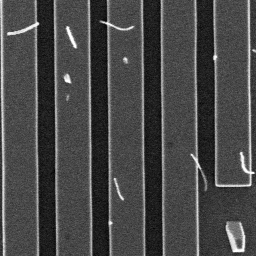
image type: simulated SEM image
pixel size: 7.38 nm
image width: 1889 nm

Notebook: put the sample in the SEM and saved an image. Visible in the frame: groups of lines, slits or small figures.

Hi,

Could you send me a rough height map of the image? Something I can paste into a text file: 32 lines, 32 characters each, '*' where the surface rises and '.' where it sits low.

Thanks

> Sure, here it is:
****...****..*****..****...****.
****...****..*****..****...****.
*****..****..*****..****...****.
*****..****...****..****...****.
*****..****...****..****...****.
*****..****...****..****...****.
*****..****...****..****...****.
*****..****...****..****...****.
*****..****...****..****...****.
*****..****...****..****...****.
*****..****...****..****...****.
*****..****...****..*****..****.
*****..****...****..*****..****.
*****..****...****..*****..****.
*****..****...****..*****..****.
*****..****...****..*****..****.
*****..****...****..*****..****.
*****..****...****..*****..****.
*****..****...****..*****..****.
*****..****...****..*****..****.
*****..****...****..*****..****.
*****..****...****..*****..****.
*****..****...****..*****..****.
*****..****...****..*****.......
*****..****...****..*****.......
*****..****...****..*****.......
*****..****...****..*****.......
*****..****...****..*****.......
*****..****...****..*****.......
*****..****...****..*****....*..
*****..****...****..*****....*..
*****..****...****..*****.......